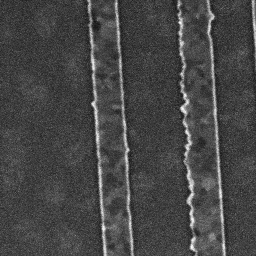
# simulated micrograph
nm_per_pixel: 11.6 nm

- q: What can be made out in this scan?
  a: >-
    one or a few lines or trenches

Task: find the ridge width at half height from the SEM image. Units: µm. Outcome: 0.335